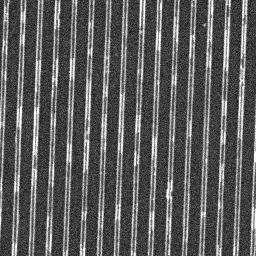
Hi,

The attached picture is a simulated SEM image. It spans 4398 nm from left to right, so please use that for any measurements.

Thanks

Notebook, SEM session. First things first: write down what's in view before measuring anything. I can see parallel lines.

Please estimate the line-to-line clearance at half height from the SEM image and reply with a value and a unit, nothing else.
0.223 microns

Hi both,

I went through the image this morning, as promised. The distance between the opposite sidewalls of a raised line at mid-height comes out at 3.5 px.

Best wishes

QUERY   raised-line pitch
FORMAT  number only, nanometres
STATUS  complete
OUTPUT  292